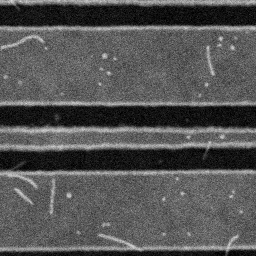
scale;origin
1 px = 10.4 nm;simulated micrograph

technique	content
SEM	lines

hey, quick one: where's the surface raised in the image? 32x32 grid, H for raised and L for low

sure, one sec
HHLHHLLLLLHHHLHLLHHHHHHHHHHHHHHH
LLLLLLLLLLLLLLLLLLLLLLLLLLLLLLLL
LLLLLLLLLLLLLLLLLLLLLLLLLLLLLLLL
HHHHHHHHHHHHHHHHHHHHHHHHHHHHHHHH
HHHHHHHHHHHHHHHHHHHHHHHHHHHHHHHH
HHHHHHHHHHHHHHHHHHHHHHHHHHHHHHHH
HHHHHHHHHHHHHHHHHHHHHHHHHHHHHHHH
HHHHHHHHHHHHHHHHHHHHHHHHHHHHHHHH
HHHHHHHHHHHHHHHHHHHHHHHHHHHHHHHH
HHHHHHHHHHHHHHHHHHHHHHHHHHHHHHHH
HHHHHHHHHHHHHHHHHHHHHHHHHHHHHHHH
HHHHHHHHHHHHHHHHHHHHHHHHHHHHHHHH
HHHHHHHHHHHHHHHHHHHHHHHHHHHHHHHH
LLLLLLLLLLLLLLLLLLLLLLLLLLLLLLLL
LLLLLLLLLLLLLLLLLLLLLLLLLLLLLLLL
LLLLLLLLLLLLLLLLLLLLLLLLLLLLLLLL
HHHHHHHHHHHHHHHHHHHHHHHHHHHHHHHH
HHHHHHHHHHHHHHHHHHHHHHHHHHHHHHHH
HHHHHHHHHHHHHHHHHHHHHHHLLHLLLLLL
LLLLLLLLLLLLLLLLLLLLLLLLLLLLLLLL
LLLLLLLLLLLLLLLLLLLLLLLLLLLLLLLL
HHHHHHHHHHHHHHHHHHHHHHHHHHHHHHHH
HHHHHHHHHHHHHHHHHHHHHHHHHHHHHHHH
HHHHHHHHHHHHHHHHHHHHHHHHHHHHHHHH
HHHHHHHHHHHHHHHHHHHHHHHHHHHHHHHH
HHHHHHHHHHHHHHHHHHHHHHHHHHHHHHHH
HHHHHHHHHHHHHHHHHHHHHHHHHHHHHHHH
HHHHHHHHHHHHHHHHHHHHHHHHHHHHHHHH
HHHHHHHHHHHHHHHHHHHHHHHHHHHHHHHH
HHHHHHHHHHHHHHHHHHHHHHHHHHHHHHHH
HHHHHHHHHHHHHHHHHHHHHHHHHHHHHHHH
LLLLLLLLLLLLLLLLLLLLLLLLLLLLLLLL